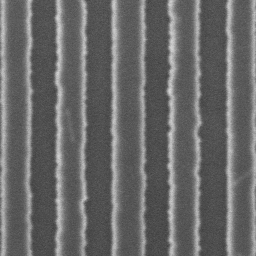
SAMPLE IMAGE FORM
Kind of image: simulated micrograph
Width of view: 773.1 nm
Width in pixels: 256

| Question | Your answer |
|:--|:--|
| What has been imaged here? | lines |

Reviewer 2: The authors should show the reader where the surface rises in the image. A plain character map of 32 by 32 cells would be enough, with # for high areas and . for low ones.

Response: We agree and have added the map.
####...####...####...####....###
####...####...####...####....###
####...####...####...####....###
####...####...####...####...####
####...####...####...####....###
####...####...####...####....###
####...####...####...####....###
####...####...####...####....###
####...####...####...####....###
####...####...####...####...####
####...####...####...####...####
####...####...####...####....###
####...####...####...####....###
####...####...####...####....###
####...####...####...####....###
####...####...####...####....###
####...####...####...####....###
####...####...####...####....###
####...####...####...####....###
####...####...####...####....###
####...####...####...####....###
####...####...####...####....###
####...####...####...####....###
####...####...####...####....###
####...####...####...####....###
####...###....####...####....###
####...####...####...####....###
####...####...####...####....###
####...####...####...####....###
####...####...####...####...####
####...####...####...####...####
####...####...####...####....###